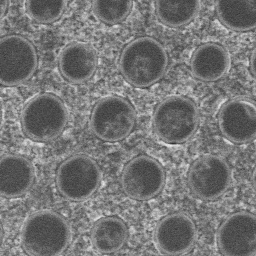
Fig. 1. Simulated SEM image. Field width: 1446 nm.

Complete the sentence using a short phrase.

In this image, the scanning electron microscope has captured a regular array of raised bodies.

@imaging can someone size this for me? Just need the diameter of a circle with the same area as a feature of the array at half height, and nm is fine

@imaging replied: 234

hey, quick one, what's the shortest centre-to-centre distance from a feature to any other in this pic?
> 364 nm